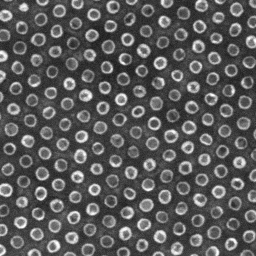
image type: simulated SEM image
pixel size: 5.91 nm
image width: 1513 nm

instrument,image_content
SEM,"a regular array of raised bodies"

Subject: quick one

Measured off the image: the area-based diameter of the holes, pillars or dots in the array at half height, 0.0677 micrometres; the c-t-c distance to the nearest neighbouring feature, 118 nm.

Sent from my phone